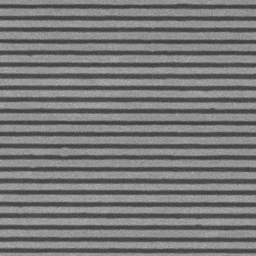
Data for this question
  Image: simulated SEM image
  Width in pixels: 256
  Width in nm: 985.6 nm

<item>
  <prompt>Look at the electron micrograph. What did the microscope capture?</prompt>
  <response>parallel lines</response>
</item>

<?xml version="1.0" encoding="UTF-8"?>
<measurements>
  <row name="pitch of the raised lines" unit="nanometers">44.8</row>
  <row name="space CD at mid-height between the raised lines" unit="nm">17.8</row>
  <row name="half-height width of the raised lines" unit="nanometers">28.4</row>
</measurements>